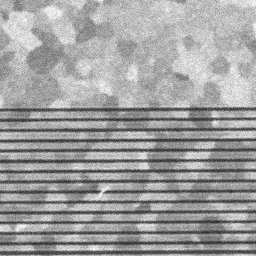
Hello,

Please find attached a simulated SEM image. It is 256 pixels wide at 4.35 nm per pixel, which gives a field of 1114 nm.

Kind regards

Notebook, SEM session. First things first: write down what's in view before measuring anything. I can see parallel lines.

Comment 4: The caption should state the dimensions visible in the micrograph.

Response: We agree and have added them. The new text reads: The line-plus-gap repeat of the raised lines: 44.4 nanometers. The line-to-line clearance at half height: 17.4 nanometres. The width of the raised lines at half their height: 5.86 pixels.